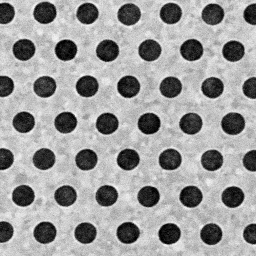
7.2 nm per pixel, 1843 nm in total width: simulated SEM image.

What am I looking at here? a regular array of holes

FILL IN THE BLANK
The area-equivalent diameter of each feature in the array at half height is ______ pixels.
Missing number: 23.1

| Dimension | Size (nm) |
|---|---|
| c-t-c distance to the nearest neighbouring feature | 299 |